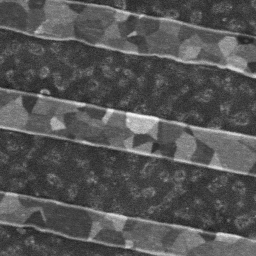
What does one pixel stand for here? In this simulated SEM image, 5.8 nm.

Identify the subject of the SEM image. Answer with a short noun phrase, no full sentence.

one or a few lines or trenches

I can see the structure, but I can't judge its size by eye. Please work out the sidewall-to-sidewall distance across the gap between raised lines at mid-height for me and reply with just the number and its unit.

0.372 um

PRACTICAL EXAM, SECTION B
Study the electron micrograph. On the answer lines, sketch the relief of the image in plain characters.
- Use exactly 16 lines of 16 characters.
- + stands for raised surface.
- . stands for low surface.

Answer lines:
+++++++.........
++++++++++++....
.....+++++++++++
..........++++++
...............+
................
+++++...........
++++++++++......
...++++++++++++.
.........+++++++
..............++
................
+++.............
+++++++.........
...++++++++++...
........++++++++